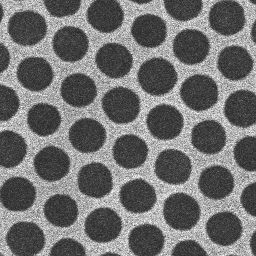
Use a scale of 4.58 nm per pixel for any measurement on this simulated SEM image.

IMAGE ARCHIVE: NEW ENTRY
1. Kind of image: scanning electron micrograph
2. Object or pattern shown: a regular array of holes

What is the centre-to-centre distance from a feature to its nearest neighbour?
208 nm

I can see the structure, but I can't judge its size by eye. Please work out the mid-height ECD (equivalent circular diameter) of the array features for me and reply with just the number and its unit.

166 nm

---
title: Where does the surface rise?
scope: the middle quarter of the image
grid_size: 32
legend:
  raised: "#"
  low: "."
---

########.........##........#####
#########........##.........####
##...#####......##..........####
.......#####..####..........###.
........###########.........##..
........###########.........#...
........####.....###.......##...
........##........###....####...
........##.........##########...
.......##..........###########..
##....###..........####....####.
##########.........###.......###
##########.........##........###
#####..####.......###.........##
###......###.....####.........##
##........###########.........##
#.........###########........###
#.........######.#####.......###
#.........###......####.....####
##........###.......############
##........##.........###########
###......###.........####...####
.###########.........###......##
.###########.........##........#
..###########.......###.........
..###......###.....####.........
.###.......############.........
.##.........###########.........
###.........###########........#
###.........####.....####.....##
###.........##........##########
####........##.........#########